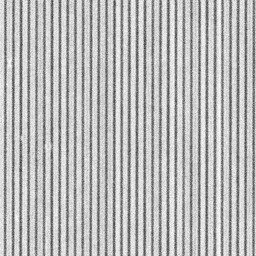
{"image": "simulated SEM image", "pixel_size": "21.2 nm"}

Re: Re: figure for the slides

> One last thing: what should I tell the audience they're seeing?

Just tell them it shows parallel lines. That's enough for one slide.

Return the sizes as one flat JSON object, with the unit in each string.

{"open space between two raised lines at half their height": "79.5 nanometers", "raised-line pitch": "164 nm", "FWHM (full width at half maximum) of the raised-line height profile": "79.5 nanometres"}